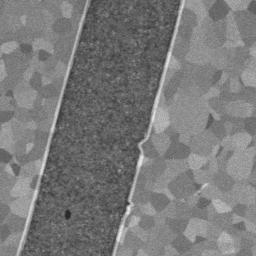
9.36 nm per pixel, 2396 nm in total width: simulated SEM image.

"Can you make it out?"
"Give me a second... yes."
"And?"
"one or a few lines or trenches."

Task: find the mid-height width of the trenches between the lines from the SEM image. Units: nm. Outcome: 875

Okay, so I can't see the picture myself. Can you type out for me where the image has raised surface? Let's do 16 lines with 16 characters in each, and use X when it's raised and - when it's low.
XXXXX------XXXXX
XXXXX------XXXXX
XXXXX------XXXXX
XXXXX------XXXXX
XXXX------XXXXXX
XXXX------XXXXXX
XXXX------XXXXXX
XXX-------XXXXXX
XXX------XXXXXXX
XXX------XXXXXXX
XXX------XXXXXXX
XX------XXXXXXXX
XX------XXXXXXXX
XX------XXXXXXXX
XX------XXXXXXXX
X------XXXXXXXXX